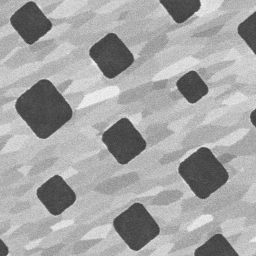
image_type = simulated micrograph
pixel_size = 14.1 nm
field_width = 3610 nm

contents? holes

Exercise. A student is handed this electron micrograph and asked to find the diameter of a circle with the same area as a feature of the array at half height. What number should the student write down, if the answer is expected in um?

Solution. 0.582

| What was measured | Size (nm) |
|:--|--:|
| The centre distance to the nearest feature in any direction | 1210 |